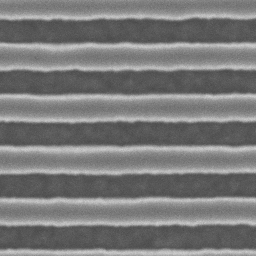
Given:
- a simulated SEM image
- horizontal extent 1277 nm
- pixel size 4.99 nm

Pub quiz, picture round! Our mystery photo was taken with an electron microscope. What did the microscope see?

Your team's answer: lines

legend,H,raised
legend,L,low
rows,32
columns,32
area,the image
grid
HHHHHHHHHHHHHHHHHHHHHHHHHHHHHHHH
HHHHHHHHHHHHHHHHHHHHHHHHHHHHHHHH
LLLLLLLLLLLLLLLLLLLLLLLLLLLLLLLL
LLLLLLLLLLLLLLLLLLLLLLLLLLLLLLLL
LLLLLLLLLLLLLLLLLLLLLLLLLLLLLLLL
HHHHHHLLLLHHLLHHHLLLHHHHHHHHHHHH
HHHHHHHHHHHHHHHHHHHHHHHHHHHHHHHH
HHHHHHHHHHHHHHHHHHHHHHHHHHHHHHHH
HHHHHHHHHHHHHHHHHHHHHHHHHHHHHHHH
LLLLLLLLLLLLLLLLLLLLLLLLLLLLLLLL
LLLLLLLLLLLLLLLLLLLLLLLLLLLLLLLL
LLLLLLLLLLLLLLLLLLLLLLLLLLLLLLLL
HHHHHHHHHHHHHHHHHHHHHHHHHHHHHHHH
HHHHHHHHHHHHHHHHHHHHHHHHHHHHHHHH
HHHHHHHHHHHHHHHHHHHHHHHHHHHHHHHH
LLLLLLLLLLLLLLLLLLLLLLLLLLLLLLLL
LLLLLLLLLLLLLLLLLLLLLLLLLLLLLLLL
LLLLLLLLLLLLLLLLLLLLLLLLLLLLLLLL
HHHHHHHHHHHHHHHHHHHHHHHHHHHHHHHH
HHHHHHHHHHHHHHHHHHHHHHHHHHHHHHHH
HHHHHHHHHHHHHHHHHHHHHHHHHHHHHHHH
HHHHHHHHHHHHHHHHHHHHHHHHHHHHHHHH
LLLLLLLLLLLLLLLLLLLLLLLLLLLLLLLL
LLLLLLLLLLLLLLLLLLLLLLLLLLLLLLLL
LLLLLLLLLLLLLLLLLLLLLLLLLLLLLLLL
HHHHHHHHHHHHHHHHHHHHHHHHHHHHHHHH
HHHHHHHHHHHHHHHHHHHHHHHHHHHHHHHH
HHHHHHHHHHHHHHHHHHHHHHHHHHHHHHHH
LLLLLLLLLLLLLLLLLLLLLLLLLLLLLLLL
LLLLLLLLLLLLLLLLLLLLLLLLLLLLLLLL
LLLLLLLLLLLLLLLLLLLLLLLLLLLLLLLL
HHHHHHHHHHHHHHHHHHHHHHHHHHHHHHHH